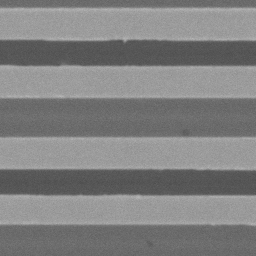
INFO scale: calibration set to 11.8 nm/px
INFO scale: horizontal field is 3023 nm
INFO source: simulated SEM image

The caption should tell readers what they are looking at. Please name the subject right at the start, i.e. lines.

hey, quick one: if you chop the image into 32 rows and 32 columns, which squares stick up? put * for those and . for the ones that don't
................................
********************************
********************************
********************************
********************************
................................
................................
................................
********************************
********************************
********************************
********************************
................................
................................
................................
................................
................................
********************************
********************************
********************************
********************************
................................
................................
................................
******...**.******..............
********************************
********************************
********************************
................................
................................
................................
................................